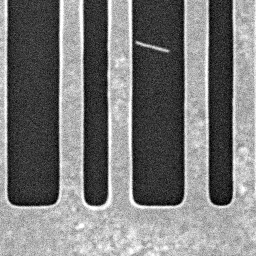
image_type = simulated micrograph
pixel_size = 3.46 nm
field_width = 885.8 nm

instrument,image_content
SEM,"groups of lines, slits or small figures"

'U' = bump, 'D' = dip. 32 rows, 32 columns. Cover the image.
UDDDDDDDUUDDDDUUDDDDDDDUUUDDDUUU
UDDDDDDDUUDDDDUUDDDDDDDUUUDDDUUU
UDDDDDDDUUDDDDUUDDDDDDDUUUDDDUUU
UDDDDDDDUUDDDDUUDDDDDDDUUUDDDUUU
UDDDDDDDUUDDDDUUDDDDDDDUUUDDDUUU
UDDDDDDDUUDDDDUUDDDDDDDUUUDDDUUU
UDDDDDDDUUDDDDUUDDDDDDDUUUDDDUUU
UDDDDDDDUUDDDDUUDDDDDDDUUUDDDUUU
UDDDDDDDUUDDDDUUDDDDDDDUUUDDDUUU
UDDDDDDDUUDDDDUUDDDDDDDUUUDDDUUU
UDDDDDDDUUDDDDUUDDDDDDDUUUDDDUUU
UDDDDDDUUUDDDDUUDDDDDDDUUUDDDUUU
UDDDDDDUUUDDDDUUDDDDDDDUUUDDDUUU
UDDDDDDUUUDDDDUUDDDDDDDUUUDDDUUU
UDDDDDDUUUDDDDUUDDDDDDDUUUDDDUUU
UDDDDDDUUUDDDDUUDDDDDDDUUUDDDUUU
UDDDDDDUUUDDDDUUDDDDDDDUUUDDDUUU
UDDDDDDUUUDDDDUUDDDDDDDUUUDDDUUU
UDDDDDDUUUDDDDUUDDDDDDDUUUDDDUUU
UDDDDDDUUUDDDDUUDDDDDDDUUUDDDUUU
UDDDDDDDUUDDDDUUDDDDDDDUUUDDDUUU
UDDDDDDDUUDDDDUUDDDDDDDUUUDDDUUU
UDDDDDDDUUDDDDUUDDDDDDDUUUDDDUUU
UDDDDDDUUUDDDDUUDDDDDDDUUUDDDUUU
UDDDDDDUUUDDDDUUUDDDDDDUUUDDDUUU
UDDDDDDUUUUDDUUUUDDDDDDUUUUDDUUU
UUUUUUUUUUUUUUUUUUUUUUUUUUUUUUUU
UUUUUUUUUUUUUUUUUUUUUUUUUUUUUUUU
UUUUUUUUUUUUUUUUUUUUUUUUUUUUUUUU
UUUUUUUUUUUUUUUUUUUUUUUUUUUUUUUU
UUUUUUUUUUUUUUUUUUUUUUUUUUUUUUUU
UUUUUUUUUUUUUUUUUUUUUUUUUUUUUUUU